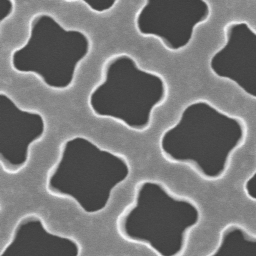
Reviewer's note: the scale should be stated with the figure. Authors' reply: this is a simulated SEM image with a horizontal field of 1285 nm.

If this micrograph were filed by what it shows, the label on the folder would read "holes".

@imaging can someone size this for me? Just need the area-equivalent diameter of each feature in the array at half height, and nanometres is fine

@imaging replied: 334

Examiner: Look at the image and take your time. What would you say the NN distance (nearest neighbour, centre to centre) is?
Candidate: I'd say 87.3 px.